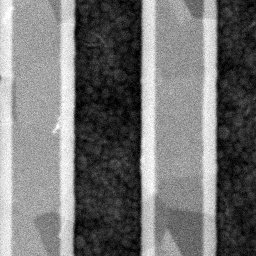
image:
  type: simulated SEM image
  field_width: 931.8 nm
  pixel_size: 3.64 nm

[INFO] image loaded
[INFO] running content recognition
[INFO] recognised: one or a few lines or trenches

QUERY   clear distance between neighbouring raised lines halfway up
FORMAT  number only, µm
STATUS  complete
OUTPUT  0.283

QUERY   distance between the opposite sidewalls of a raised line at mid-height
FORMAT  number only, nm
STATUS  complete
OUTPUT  239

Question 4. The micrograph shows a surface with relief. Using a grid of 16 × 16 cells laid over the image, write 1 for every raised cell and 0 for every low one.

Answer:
1111000001111000
1111000001111000
1111000001111000
1111000001111000
1111000001111000
1111000001111000
1111000001111000
1111000001111000
1111000001111000
1111000001111000
1111000001111000
1111000001111000
1111000001111000
1111000001111000
1111000001111000
1111000001111000